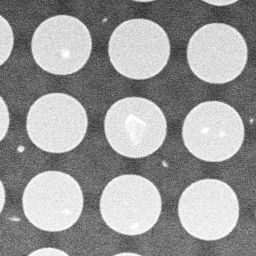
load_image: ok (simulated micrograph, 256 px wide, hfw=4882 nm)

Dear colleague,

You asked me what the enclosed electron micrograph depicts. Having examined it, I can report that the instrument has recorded an array of small figures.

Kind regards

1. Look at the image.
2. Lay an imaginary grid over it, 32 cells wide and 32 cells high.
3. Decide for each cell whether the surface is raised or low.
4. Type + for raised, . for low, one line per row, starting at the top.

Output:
...........................++...
................................
+.....++++......++..............
+....++++++....+++++.....++++...
++..+++++++...+++++++...++++++..
++..+++++++...+++++++...+++++++.
+...+++++++...+++++++..++++++++.
+...+++++++...+++++++...+++++++.
.....+++++....++++++....++++++..
................+++......+++++..
................................
................................
.....++++......+++..............
+...++++++....++++++....+++++...
+..++++++++..+++++++...+++++++..
+..++++++++..++++++++..+++++++..
+...+++++++..++++++++..+++++++..
....++++++...+++++++...+++++++..
.....++++.....++++++...+++++++..
................++......+++++...
................................
......+.........................
....+++++.....++++.......++.....
...+++++++...++++++.....+++++...
+..+++++++...+++++++...++++++...
...+++++++...+++++++..++++++++..
...+++++++...+++++++..++++++++..
....++++++...+++++++...+++++++..
.....+++......+++++....++++++...
........................++++....
................................
....++++........................